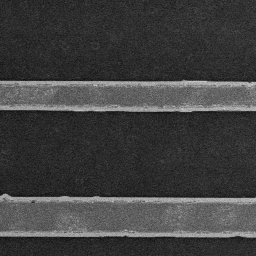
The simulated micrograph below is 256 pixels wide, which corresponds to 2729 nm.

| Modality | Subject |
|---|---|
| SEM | one or a few lines or trenches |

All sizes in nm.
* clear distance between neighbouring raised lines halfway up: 964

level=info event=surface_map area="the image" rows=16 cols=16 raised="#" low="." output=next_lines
................
................
................
................
................
################
################
................
................
................
................
................
############....
################
################
................